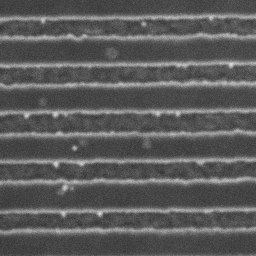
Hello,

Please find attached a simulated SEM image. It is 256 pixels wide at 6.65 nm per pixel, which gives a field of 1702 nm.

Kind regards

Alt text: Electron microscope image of lines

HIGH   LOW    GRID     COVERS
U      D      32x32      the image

UUUUUUUUUUUUUUUUUUUUUUUUUUUUUUUU
UUUUUUUUUUUUUUUUUUUUUUUUUUUUUUUU
DDDDDDDDDDDDDDDDDDDDDDDDDDDDDDDD
DDDDDDDDDDDDDDDDDDDDDDDDDDDDDDDD
DDDDDDDDUDUUDDDDDDUDUDDUUUUUUUDU
UUUUUUUUUUUUUUUUUUUUUUUUUUUUUUUU
UUUUUUUUUUUUUUUUUUUUUUUUUUUUUUUU
UUUUUUUUUUUUUUUUUUUUUUUUUUUUUUUU
DDDDDDDDDDDDDDDDDDDDDDDDDDDDDDDD
DDDDDDDDDDDDDDDDDDDDDDDDDDDDDDDD
DDDDDDDDDDUDDDDUUUUUUUUUUUUUUUUU
UUUUUUUUUUUUUUUUUUUUUUUUUUUUUUUU
UUUUUUUUUUUUUUUUUUUUUUUUUUUUUUUU
UUUUUUUUUUUUUUUUUUUUUUUUUUUUUUUU
DDDDDDDDDDDDDDDDDDDDDDDDDDDDDDDD
DDDDDDDDDDDDDDDDDDDDDDDDDDDDDDDD
DDDDDDDDDDDDDDDDDDDDDDDDDUDUUUUU
UUUUUUUUUUUUUUUUUUUUUUUUUUUUUUUU
UUUUUUUUUUUUUUUUUUUUUUUUUUUUUUUU
UUUUUUUUUUUUUUUUUUUUUUUUUUUUUUUU
DDDDDDDDDDDDDDDDDDDDDDDDDDDDDDDD
DDDDDDDDDDDDDDDDDDDDDDDDDDDDDDDD
DDDDDDDDDDDDUDDDDDUUUUUDUUUUUUUU
UUUUUUUUUUUUUUUUUUUUUUUUUUUUUUUU
UUUUUUUUUUUUUUUUUUUUUUUUUUUUUUUU
UUUUUUUUUUUUUUUUUUUUUUUUUUUUUUUU
UUUUUUUUUUUUUUUUUUDDUDDDDDDDDDDD
DDDDDDDDDDDDDDDDDDDDDDDDDDDDDDDD
DDDDDDDDDDDDDDUDDDUDDDDDDDDUDDUU
UUUUUUUUUUUUUUUUUUUUUUUUUUUUUUUU
UUUUUUUUUUUUUUUUUUUUUUUUUUUUUUUU
UUUUUUUUUUUUUUUUUUUUUUUUUUUUUUUU